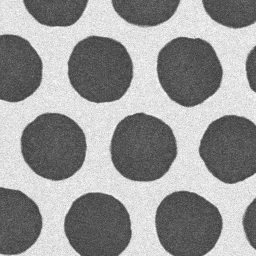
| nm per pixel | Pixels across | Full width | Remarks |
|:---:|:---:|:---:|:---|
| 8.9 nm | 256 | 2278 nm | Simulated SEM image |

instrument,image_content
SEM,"holes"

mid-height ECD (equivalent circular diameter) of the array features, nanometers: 599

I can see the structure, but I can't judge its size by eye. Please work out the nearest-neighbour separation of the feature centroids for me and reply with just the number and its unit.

0.792 microns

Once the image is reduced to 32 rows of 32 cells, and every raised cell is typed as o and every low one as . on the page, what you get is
ooo........ooo........ooo.......
oooo......oooo........oooo......
oooo......oooooo.....oooooo.....
ooooooooooooooooooooooooooooo.oo
..ooooooooo.oooooooooooooooooooo
....oooooo.....oooooo.....oooooo
.....oooo.......oooo.......oooo.
.....oooo.......oooo.......oooo.
.....ooo.........ooo........ooo.
.....oooo........ooo........ooo.
.....oooo.......oooo........ooo.
....oooooo......ooooo......ooooo
...oooooooo....ooooooo....oooooo
oooooooooooooooooooooooooooooooo
ooooo...oooooooo...ooooooooo..oo
oooo......ooooo......ooooo......
ooo.......oooo........oooo......
ooo........ooo........ooo.......
ooo........ooo........ooo.......
ooo........ooo........ooo.......
ooo.......oooo.......ooooo......
oooo......ooooo......ooooo......
oooooo..oooooooo...oooooooo...oo
.ooooooooooooooooooooooooooooooo
...ooooooo....ooooooo....ooooooo
.....oooo......ooooo.......oooo.
.....ooo........ooo........oooo.
.....ooo........ooo.........oo..
.....ooo........ooo.........oo..
.....ooo........oooo........ooo.
....ooooo.......oooo.......oooo.
...ooooooo.....oooooo.....oooooo